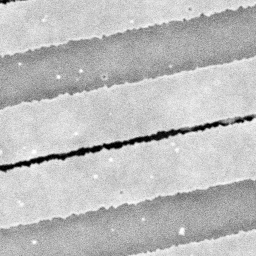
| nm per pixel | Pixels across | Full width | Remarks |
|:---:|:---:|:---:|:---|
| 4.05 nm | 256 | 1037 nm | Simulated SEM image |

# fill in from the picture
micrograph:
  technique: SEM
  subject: lines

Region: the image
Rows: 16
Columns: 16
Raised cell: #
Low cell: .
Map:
###############.
##########......
#####...........
................
...........#####
.......#########
.###############
################
################
################
################
##############..
#########.......
####............
...............#
...........#####